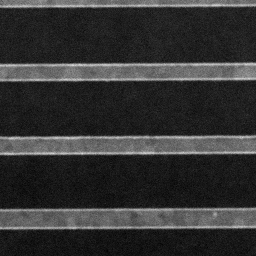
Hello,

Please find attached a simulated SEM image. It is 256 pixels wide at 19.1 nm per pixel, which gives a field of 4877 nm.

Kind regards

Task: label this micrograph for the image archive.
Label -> one or a few lines or trenches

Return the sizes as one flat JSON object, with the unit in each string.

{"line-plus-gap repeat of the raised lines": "1390 nanometres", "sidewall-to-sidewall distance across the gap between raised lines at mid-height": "1090 nanometres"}